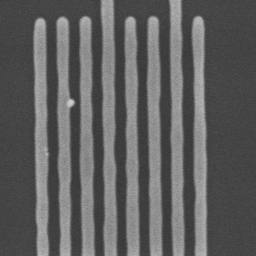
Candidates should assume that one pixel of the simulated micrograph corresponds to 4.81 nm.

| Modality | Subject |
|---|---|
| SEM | groups of lines, slits or small figures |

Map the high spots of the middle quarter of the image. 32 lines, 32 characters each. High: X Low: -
X---XXX---XXX---XX---XXX---XX---
X---XXX---XXX---XX---XXX---XX---
X---XXX---XXX---XX---XXX---XX---
X---XXX---XXX---XX---XXX---XXX--
X---XXX---XXX---XX---XXX---XXX--
X---XXX---XXX---XX---XXX---XXX--
X---XXX---XXX---XX---XXX---XX---
X---XXX---XXX---XX---XXX---XX---
XX--XXX---XXX---XX---XXX---XX---
XXX-XXX---XXX---XX---XXX---XX---
XX--XXX---XXX---XX---XXX---XX---
X---XXX---XXX---XX---XXX---XX---
X---XXX---XXX---XX---XXX---XX---
X---XXX---XXX---XX---XXX---XX---
X---XXX---XXX---XX---XXX---XX---
X---XXX---XXX---XX---XXX---XX---
X---XXX---XXX---XX---XXX---XXX--
X---XXX---XXX---XX---XXX---XXX--
X---XXX---XXX---XX---XXX---XXX--
X---XXX---XXX---XX---XXX---XXX--
X---XXX---XX----XX---XXX---XXX--
X---XXX---XX----XX---XXX---XXX--
X---XXX---XX----XX---XXX---XXX--
X---XXX---XXX---XX---XXX---XXX--
XX--XXX---XXX---XX---XXX---XXX--
XX--XXX---XXX---XX---XXX---XXX--
XX--XXX---XXX---XX---XXX---XXX--
XX--XXX---XXX---XX---XXX---XXX--
XX--XXX---XXX---XX---XXX---XXX--
X---XXX---XXX---XX---XXX---XXX--
X---XXX---XXX---XX---XXX---XXX--
X----XX---XXX---XX---XXX---XXX--